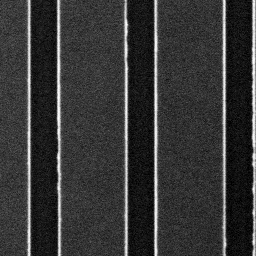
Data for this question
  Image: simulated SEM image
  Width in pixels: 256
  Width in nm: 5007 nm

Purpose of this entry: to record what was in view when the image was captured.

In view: lines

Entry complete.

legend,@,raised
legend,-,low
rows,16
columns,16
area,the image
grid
@@--@@@@--@@@@--
@@--@@@@--@@@@--
@@--@@@@--@@@@--
@@--@@@@--@@@@--
@@--@@@@--@@@@--
@@--@@@@--@@@@--
@@--@@@@--@@@@--
@@--@@@@--@@@@--
@@--@@@@--@@@@--
@@--@@@@--@@@@--
@@--@@@@--@@@@--
@@--@@@@--@@@@--
@@--@@@@--@@@@--
@@--@@@@--@@@@--
@@--@@@@--@@@@--
@@--@@@@--@@@@--